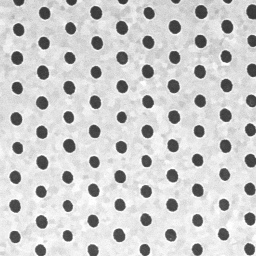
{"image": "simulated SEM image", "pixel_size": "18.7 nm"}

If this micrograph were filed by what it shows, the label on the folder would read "a regular array of holes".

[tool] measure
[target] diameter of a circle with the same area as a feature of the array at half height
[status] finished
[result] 242 nanometres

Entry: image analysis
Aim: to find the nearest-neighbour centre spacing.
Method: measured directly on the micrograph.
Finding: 0.542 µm